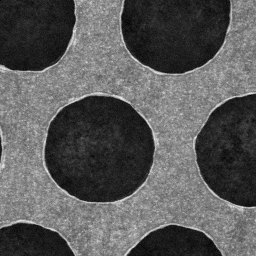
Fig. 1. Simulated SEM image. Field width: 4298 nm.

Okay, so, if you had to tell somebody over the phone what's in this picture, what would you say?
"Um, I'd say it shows holes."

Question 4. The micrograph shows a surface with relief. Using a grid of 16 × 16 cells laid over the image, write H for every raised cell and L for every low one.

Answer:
LLLLLHHHLLLLLLHH
LLLLLHHHLLLLLLHH
LLLLHHHHLLLLLLHH
LLLLHHHHLLLLLHHH
HHHHHHHHHHLLHHHH
HHHHHHHHHHHHHHHH
HHHHLLLLHHHHHHLL
HHHLLLLLLHHHHLLL
HHHLLLLLLLHHLLLL
HHHLLLLLLLHHLLLL
HHHLLLLLLHHHLLLL
HHHHLLLLLHHHHLLL
HHHHHLLLHHHHHHLL
HHHHHHHHHHHHHHHH
LLLHHHHHHLLLLHHH
LLLLHHHHLLLLLLHH